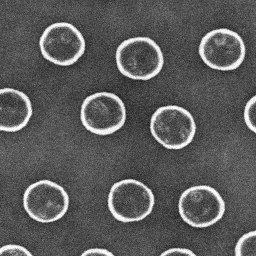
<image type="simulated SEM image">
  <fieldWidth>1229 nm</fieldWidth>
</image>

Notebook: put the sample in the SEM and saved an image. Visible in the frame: a regular array of raised bodies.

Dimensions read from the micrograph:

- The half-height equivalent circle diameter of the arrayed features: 195 nm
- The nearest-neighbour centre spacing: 339 nanometers